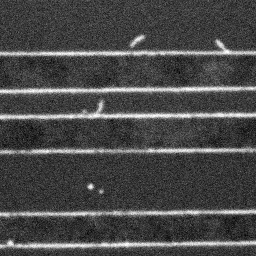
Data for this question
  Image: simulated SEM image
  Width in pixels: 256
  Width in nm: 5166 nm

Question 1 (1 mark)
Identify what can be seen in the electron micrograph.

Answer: lines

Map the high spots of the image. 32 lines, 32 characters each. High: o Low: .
oooooooooooooooooooooooooooooooo
oooooooooooooooooooooooooooooooo
oooooooooooooooooooooooooooooooo
oooooooooooooooooooooooooooooooo
oooooooooooooooooooooooooooooooo
oooooooooooooooooooooooooooooooo
oooooooooooooooooooooooooooooooo
................................
................................
................................
................................
oooooooooooooooooooooooooooooooo
oooooooooooooooooooooooooooooooo
oooooooooooooooooooooooooooooooo
oooooooooooooooooooooooo........
................................
................................
................................
................................
oooooooooooooooooooooooooooooooo
oooooooooooooooooooooooooooooooo
oooooooooooooooooooooooooooooooo
oooooooooooooooooooooooooooooooo
oooooooooooooooooooooooooooooooo
oooooooooooooooooooooooooooooooo
oooooooooooooooooooooooooooooooo
oooooooooooooooooooooooooooooooo
................................
................................
................................
.....................ooooooooooo
oooooooooooooooooooooooooooooooo